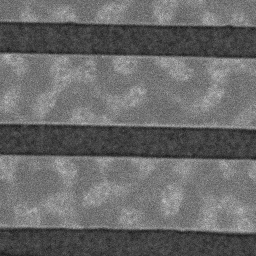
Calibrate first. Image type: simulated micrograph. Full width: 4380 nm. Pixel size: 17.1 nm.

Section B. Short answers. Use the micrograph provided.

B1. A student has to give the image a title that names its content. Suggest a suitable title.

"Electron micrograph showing one or a few lines or trenches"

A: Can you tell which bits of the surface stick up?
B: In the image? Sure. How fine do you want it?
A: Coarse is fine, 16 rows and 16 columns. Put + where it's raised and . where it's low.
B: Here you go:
++++++++++++++++
.......+++++++++
................
++++++++........
++++++++++++++++
++++++++++++++++
++++++++++++++++
++++++++++++++++
................
................
++++++++++++++++
++++++++++++++++
++++++++++++++++
++++++++++++++++
..............++
................